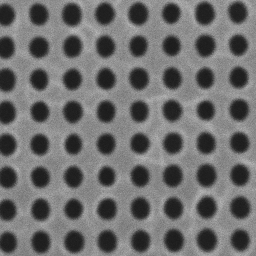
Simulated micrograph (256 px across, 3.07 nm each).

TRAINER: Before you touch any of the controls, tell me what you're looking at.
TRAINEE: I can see a regular array of holes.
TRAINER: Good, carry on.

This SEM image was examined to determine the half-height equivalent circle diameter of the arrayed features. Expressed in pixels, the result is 20.1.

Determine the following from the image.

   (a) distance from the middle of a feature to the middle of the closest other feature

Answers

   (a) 99.2 nm